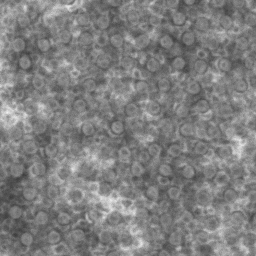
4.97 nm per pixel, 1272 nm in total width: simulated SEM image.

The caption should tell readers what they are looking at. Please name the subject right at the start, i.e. a regular array of raised bodies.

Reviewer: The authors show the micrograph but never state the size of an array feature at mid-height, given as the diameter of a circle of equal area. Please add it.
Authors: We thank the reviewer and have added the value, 0.0567 um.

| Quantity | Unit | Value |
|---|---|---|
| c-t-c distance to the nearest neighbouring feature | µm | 0.0713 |